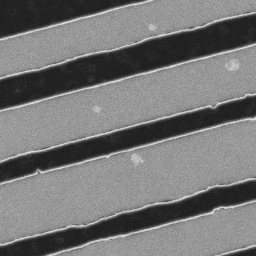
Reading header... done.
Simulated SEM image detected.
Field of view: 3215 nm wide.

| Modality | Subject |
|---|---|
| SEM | one or a few lines or trenches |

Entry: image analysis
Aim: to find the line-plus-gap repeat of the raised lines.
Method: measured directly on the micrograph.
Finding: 972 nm